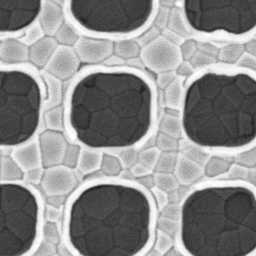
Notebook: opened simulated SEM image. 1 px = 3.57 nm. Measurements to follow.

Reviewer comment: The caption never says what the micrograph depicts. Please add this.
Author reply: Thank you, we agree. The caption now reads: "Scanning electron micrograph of holes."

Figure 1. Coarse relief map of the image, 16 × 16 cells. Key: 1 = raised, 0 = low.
0011000001110000
0011100001110000
1111111111111111
1111111111111111
0111111111111111
0011100001110000
0001000001110000
0011000001100000
0011100001110000
1111111111111111
1111111111111111
0111111111111111
0011100001110000
0011000001100000
0011000001100000
0011100001110000